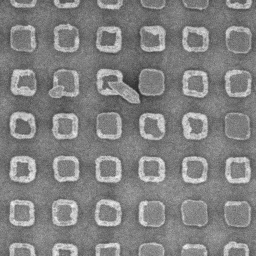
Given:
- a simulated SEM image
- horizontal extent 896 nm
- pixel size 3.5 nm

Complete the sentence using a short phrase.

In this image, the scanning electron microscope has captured a regular array of raised bodies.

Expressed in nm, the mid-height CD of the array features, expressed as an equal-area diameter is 95.9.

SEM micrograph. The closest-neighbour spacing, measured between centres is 150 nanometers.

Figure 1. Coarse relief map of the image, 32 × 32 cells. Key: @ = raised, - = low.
--@@---@@@--@@@---@@---@@@--@@@-
--------------------------------
--------------------------------
--@@---@@----@@---@@---@@----@--
-@@@---@@@--@@@---@@@--@@@--@@@-
-@@@---@@@--@@@---@@@--@@@--@@@-
-------------@---------------@@-
--------------------------------
--------------------------------
--@@---@@@--@@@---@@---@@@--@@@-
-@@@---@@@--@@@@-@@@---@@@--@@@-
--@@--@@@@---@@@@-@@---@@@--@@@-
----------------@---------------
--------------------------------
--@@---@@---@@@---@@---@@---@@@-
-@@@---@@@--@@@---@@@--@@@--@@@-
-@@@---@@@--@@@---@@@--@@@--@@@-
--------------------------------
--------------------------------
--------------------------------
-@@@---@@@--@@@--@@@---@@@--@@@-
-@@@---@@@--@@@--@@@@--@@@--@@@-
--@@---@@---@@@---@@---@@@---@@-
--------------------------------
--------------------------------
-@@@---@@---@@@---@@---@@@--@@@-
-@@@---@@@--@@@--@@@@--@@@--@@@-
-@@@---@@@--@@@--@@@@--@@@--@@@-
--------------------------------
--------------------------------
--@@---------@@---@@---------@--
-@@@---@@@--@@@--@@@---@@@--@@@-